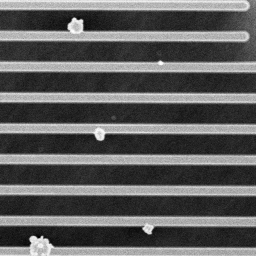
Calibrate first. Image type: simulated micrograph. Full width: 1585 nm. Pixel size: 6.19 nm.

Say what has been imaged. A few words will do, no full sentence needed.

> groups of lines, slits or small figures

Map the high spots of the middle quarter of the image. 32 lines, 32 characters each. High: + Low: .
++++++++++++++++++++++++++++++++
++++++++++++++++++++++++++++++++
................................
................................
................................
................................
................................
++++++++++++++++++++++++++++++++
++++++++++++++++++++++++++++++++
........++++++++++++++++++++++++
................................
................................
................................
................................
................................
++++++++++++++++++++++++++++++++
++++++++++++++++++++++++++++++++
.......+++......................
........++......................
................................
................................
................................
................................
++++++++++++++++++++++++++++++++
++++++++++++++++++++++++++++++++
................................
................................
................................
................................
................................
++++++..........................
++++++++++++++++++++++++++++++++